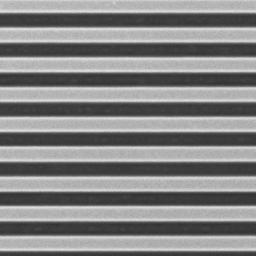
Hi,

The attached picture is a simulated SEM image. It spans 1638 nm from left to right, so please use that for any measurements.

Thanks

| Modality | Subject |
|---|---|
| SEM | parallel lines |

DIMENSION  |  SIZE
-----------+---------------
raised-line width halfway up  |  110 nanometres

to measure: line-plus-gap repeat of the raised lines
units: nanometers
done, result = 191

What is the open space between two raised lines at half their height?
80.8 nm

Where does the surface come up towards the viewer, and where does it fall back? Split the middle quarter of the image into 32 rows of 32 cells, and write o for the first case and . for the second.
oooooooooooooooooooooooooooooooo
oooooooooooooooooooooooooooooooo
................................
................................
................................
................................
oooooooooooooooooooooooooooooooo
oooooooooooooooooooooooooooooooo
oooooooooooooooooooooooooooooooo
oooooooooooooooooooooooooooooooo
................................
................................
................................
oooooooooooooooooooooooooooooooo
oooooooooooooooooooooooooooooooo
oooooooooooooooooooooooooooooooo
oooooooooooooooooooooooooooooooo
................................
................................
................................
................................
oooooooooooooooooooooooooooooooo
oooooooooooooooooooooooooooooooo
oooooooooooooooooooooooooooooooo
oooooooooooooooooooooooooooooooo
................................
................................
................................
oooooooooooooooooooooooooooooooo
oooooooooooooooooooooooooooooooo
oooooooooooooooooooooooooooooooo
oooooooooooooooooooooooooooooooo